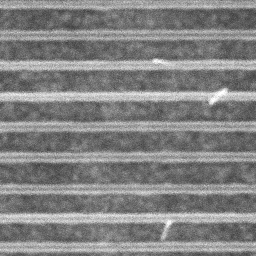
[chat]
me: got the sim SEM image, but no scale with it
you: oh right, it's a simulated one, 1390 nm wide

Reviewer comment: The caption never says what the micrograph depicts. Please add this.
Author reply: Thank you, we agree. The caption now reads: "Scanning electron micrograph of parallel lines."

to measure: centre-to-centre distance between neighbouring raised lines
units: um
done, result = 0.165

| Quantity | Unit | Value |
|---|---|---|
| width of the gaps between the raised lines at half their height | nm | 129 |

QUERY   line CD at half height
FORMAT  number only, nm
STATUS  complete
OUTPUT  35.9